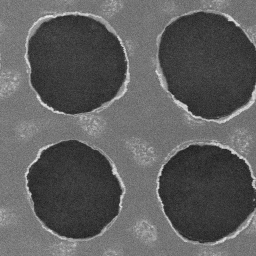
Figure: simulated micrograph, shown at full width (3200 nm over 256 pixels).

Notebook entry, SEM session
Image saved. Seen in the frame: holes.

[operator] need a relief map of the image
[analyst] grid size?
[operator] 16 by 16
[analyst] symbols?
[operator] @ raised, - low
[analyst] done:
@@@@@@@@@@@@@@@@
@@----@@@@@----@
@@-----@@@------
@@------@@------
@@------@@------
@@------@@------
@@@---@@@@@----@
@@@@@@@@@@@@@-@@
@@@@@@@@@@@@@@@@
@@@---@@@@@---@@
@@-----@@@------
@@------@@------
@@------@@------
@@-----@@@------
@@@---@@@@@----@
@@@@@@@@@@@@@@@@